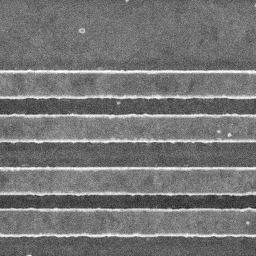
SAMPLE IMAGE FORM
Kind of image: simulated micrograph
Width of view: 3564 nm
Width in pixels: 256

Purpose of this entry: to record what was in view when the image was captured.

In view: lines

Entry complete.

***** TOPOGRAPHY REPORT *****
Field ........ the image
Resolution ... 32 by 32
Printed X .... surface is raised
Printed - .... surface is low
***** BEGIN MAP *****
--------------------------------
--------------------------------
--------------------------------
--------------------------------
--------------------------------
--------------------------------
--------------------------------
--------------------------------
--------------------------------
XXXXXXXXXXXXXXXXXXXXXXXXXXXXXXXX
XXXXXXXXXXXXXXXXXXXXXXXXXXXXXXXX
XXXXXXXXXXXXXXXXXXXXXXXXXXXXXXXX
--------------------------------
--------------------------------
XXXXXXXXXXXXXXXXXXXXXXXXXXXXXXXX
XXXXXXXXXXXXXXXXXXXXXXXXXXXXXXXX
XXXXXXXXXXXXXXXXXXXXXXXXXXXXXXXX
XXXXXXXXXXXXXXXXXXXXXXXXXXXXXXXX
--------------------------------
--------------------------------
--------------------------------
XXXXXXXXXXXXXXXXXXXXXXXXXXXXXXXX
XXXXXXXXXXXXXXXXXXXXXXXXXXXXXXXX
XXXXXXXXXXXXXXXXXXXXXXXXXXXXXXXX
--------------------------------
--------------------------------
XXXXXXXXXXXXXXXXXXXXXXXXXXXXXXXX
XXXXXXXXXXXXXXXXXXXXXXXXXXXXXXXX
XXXXXXXXXXXXXXXXXXXXXXXXXXXXXXXX
XXXXX--XXX-XX-XXXXXX---XXXXX-XXX
--------------------------------
--------------------------------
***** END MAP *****